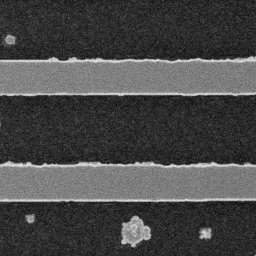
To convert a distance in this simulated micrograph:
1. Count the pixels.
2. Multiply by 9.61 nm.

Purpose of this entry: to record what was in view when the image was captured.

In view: lines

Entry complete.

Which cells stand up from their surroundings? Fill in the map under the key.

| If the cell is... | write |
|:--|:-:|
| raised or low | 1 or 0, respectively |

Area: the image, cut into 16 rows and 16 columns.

0000000000000000
0000000000000000
0000000000000000
0000000000000000
1111111111111111
1111111111111111
0000000000000000
0000000000000000
0000000000000000
0000000000000000
1111111111111111
1111111111111111
1111111111111111
0000000000000000
0000000000000000
0000000000000000